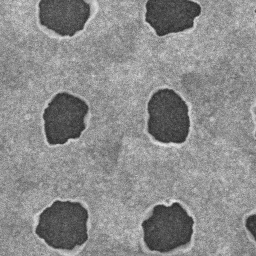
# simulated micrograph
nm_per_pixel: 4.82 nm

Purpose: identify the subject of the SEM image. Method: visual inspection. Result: holes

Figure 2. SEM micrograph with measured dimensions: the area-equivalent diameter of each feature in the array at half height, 0.243 µm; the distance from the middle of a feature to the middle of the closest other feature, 498 nm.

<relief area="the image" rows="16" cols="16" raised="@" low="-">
@@----@@@---@@@@
@@@--@@@@---@@@@
@@@@@@@@@@@@@@@@
@@@@@@@@@@@@@@@@
@@@@@@@@@@@@@@@@
@@@@@@@@@@@@@@@@
@@@--@@@@---@@@@
@@@--@@@@---@@@@
@@@--@@@@---@@@@
@@@@@@@@@@@@@@@@
@@@@@@@@@@@@@@@@
@@@@@@@@@@@@@@@@
@@@@@@@@@@@@@@@@
@@@--@@@@---@@@@
@@---@@@@---@@@@
@@@--@@@@--@@@@@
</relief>